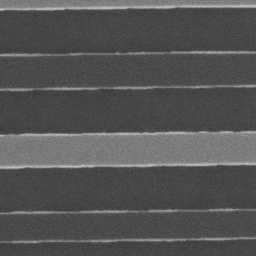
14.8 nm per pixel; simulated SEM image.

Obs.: lines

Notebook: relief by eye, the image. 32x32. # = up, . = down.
################################
................................
................................
................................
................................
................................
................................
################################
################################
################################
################################
................................
................................
................................
................................
................................
............................#..#
################################
################################
################################
################################
................................
................................
................................
................................
................................
............####################
################################
################################
################################
................................
................................